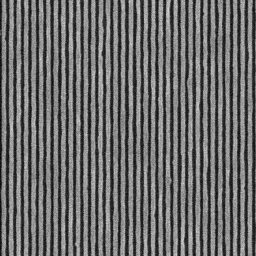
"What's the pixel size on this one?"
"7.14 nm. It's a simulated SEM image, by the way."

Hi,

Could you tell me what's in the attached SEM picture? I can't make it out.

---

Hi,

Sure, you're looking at parallel lines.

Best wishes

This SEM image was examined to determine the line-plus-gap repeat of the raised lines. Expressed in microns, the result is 0.0533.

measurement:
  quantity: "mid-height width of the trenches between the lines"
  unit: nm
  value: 24.1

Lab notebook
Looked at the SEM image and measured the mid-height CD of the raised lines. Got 30.4 nm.